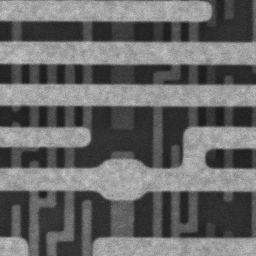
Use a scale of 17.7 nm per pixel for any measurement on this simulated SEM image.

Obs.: wiring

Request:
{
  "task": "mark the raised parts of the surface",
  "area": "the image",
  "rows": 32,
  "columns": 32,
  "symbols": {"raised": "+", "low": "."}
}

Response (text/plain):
++++++++++++++++++++++++++......
++++++++++++++++++++++++++......
++++++++++++++++++++++++++......
................................
................................
++++++++++++++++++++++++++++++++
++++++++++++++++++++++++++++++++
++++++++++++++++++++++++++++++++
................................
................................
................................
++++++++++++++++++++++++++++++++
++++++++++++++++++++++++++++++++
................................
................................
................................
+++++++++++............+++++++++
+++++++++++............+++++++++
.......................+++++++++
.......................+++......
.............+++++.....+++......
++++++++++++++++++++++++++++++++
++++++++++++++++++++++++++++++++
++++++++++++++++++++++++++++++++
.............+++++..............
................................
................................
................................
................................
................................
+++.........++++++++++++++++++++
+++.........++++++++++++++++++++